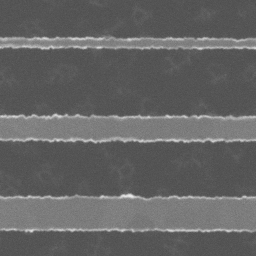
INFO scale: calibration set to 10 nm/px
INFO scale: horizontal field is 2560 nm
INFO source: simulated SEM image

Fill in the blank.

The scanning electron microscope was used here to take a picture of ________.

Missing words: one or a few lines or trenches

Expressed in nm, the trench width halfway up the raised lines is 611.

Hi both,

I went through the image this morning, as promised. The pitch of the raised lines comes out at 0.853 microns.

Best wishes